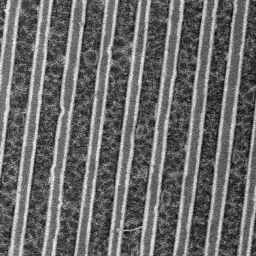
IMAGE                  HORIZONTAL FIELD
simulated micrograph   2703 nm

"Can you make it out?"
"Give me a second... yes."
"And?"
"parallel lines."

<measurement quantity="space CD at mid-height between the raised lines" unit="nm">229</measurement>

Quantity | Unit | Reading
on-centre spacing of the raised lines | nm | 341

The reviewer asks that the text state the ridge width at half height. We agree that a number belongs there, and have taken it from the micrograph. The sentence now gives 110 nm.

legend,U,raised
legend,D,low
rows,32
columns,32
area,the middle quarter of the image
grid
DUUDDDDDDUUDDDDDDUUDDDDDDUUUDDDD
UUUDDDDDDUUDDDDDDUUDDDDDDUUUDDDD
UUUDDDDDDUUDDDDDDUUDDDDDDUUUDDDD
UUUDDDDDUUUDDDDDDUUDDDDDDUUDDDDD
UUUDDDDDUUUDDDDDDUUDDDDDDUUDDDDD
UUUDDDDDUUUDDDDDUUUDDDDDUUUDDDDD
UUUDDDDDUUDDDDDDUUUDDDDDUUUDDDDD
UUDDDDDDUUDDDDDDUUUDDDDDUUUDDDDD
UUDDDDDDUUDDDDDDUUUDDDDDUUUDDDDD
UUDDDDDDUUDDDDDDUUDDDDDDUUDDDDDD
UUDDDDDDUUDDDDDDUUDDDDDDUUDDDDDD
UUDDDDDDUUDDDDDDUUDDDDDDUUDDDDDD
UUDDDDDUUUDDDDDDUUDDDDDDUUDDDDDD
UDDDDDDUUUDDDDDUUUDDDDDDUUDDDDDD
UDDDDDDUUDDDDDDUUUDDDDDUUUDDDDDD
UDDDDDDUUDDDDDDUUDDDDDDUUUDDDDDD
UDDDDDDUUDDDDDDUUDDDDDDUUDDDDDDD
UDDDDDDUUDDDDDDUUDDDDDDUUDDDDDDD
UDDDDDDUUDDDDDDUUDDDDDDUUDDDDDDU
UDDDDDDUUDDDDDUUUDDDDDDUUDDDDDDU
UDDDDDUUUDDDDDUUUDDDDDDUUDDDDDDU
UDDDDDUUUDDDDDUUUDDDDDDUUDDDDDDU
DDDDDDUUDDDDDDUUUDDDDDUUUDDDDDDU
DDDDDDUUDDDDDDUUUDDDDDUUUDDDDDDU
DDDDDDUUDDDDDDUUUDDDDDUUUDDDDDDU
DDDDDDUUDDDDDDUUDDDDDDUUDDDDDDDU
DDDDDDUUDDDDDDUUDDDDDDUUDDDDDDUU
DDDDDDUUDDDDDUUUDDDDDDUUDDDDDDUU
DDDDDDUUDDDDDUUUDDDDDUUUDDDDDDUU
DDDDDUUUDDDDDUUUDDDDDUUUDDDDDDUU
DDDDDUUUDDDDDUUUDDDDDUUUDDDDDDUU
DDDDDUUDDDDDDUUDDDDDDUUUDDDDDDUU